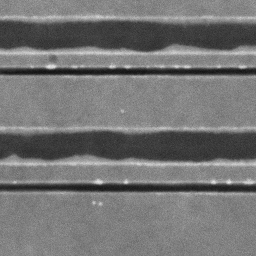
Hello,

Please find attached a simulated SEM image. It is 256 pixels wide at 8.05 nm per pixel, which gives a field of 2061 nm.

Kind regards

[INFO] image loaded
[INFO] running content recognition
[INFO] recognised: lines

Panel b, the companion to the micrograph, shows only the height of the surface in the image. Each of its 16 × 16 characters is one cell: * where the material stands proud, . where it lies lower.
****************
................
................
****************
****************
****************
****************
****************
................
................
****************
****************
****************
****************
****************
****************